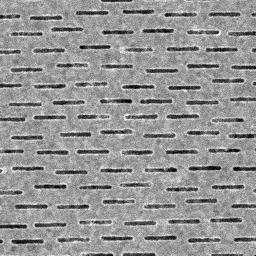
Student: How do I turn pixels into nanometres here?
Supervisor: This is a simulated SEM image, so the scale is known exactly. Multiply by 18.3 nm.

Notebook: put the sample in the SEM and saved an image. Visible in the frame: a regular array of holes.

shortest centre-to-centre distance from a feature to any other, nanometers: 482